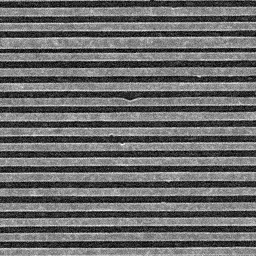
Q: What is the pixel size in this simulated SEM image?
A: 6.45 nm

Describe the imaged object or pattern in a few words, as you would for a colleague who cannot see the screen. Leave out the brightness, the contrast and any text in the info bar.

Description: parallel lines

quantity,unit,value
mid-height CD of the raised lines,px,7.88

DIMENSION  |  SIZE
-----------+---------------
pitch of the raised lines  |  96.8 nanometres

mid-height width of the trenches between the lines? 45.9 nm